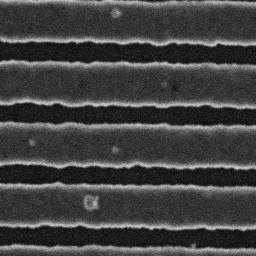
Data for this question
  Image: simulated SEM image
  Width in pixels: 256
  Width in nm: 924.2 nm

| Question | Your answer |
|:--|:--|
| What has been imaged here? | lines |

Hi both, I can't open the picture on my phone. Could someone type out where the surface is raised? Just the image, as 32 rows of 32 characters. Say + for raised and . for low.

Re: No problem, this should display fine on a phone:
+++++++++++++++++++.++++++++++++
++++++++++++++++++++++++++++++++
++++++++++++++++++++++++++++++++
++++++++++++++++++++++++++++++++
++++++++++++++++++++++++++++++++
...................++....++..+++
................................
................................
++++++++++++++++++++++++++++++++
++++++++++++++++++++++++++++++++
++++++++++++++++++++++++++++++++
++++++++++++++++++++++++++++++++
++++++++++++++++++++++++++++++++
..............................++
................................
++......+.......................
++++++++++++++++++++++++++++++++
++++++++++++++++++++++++++++++++
++++++++++++++++++++++++++++++++
++++++++++++++++++++++++++++++++
++.+++++++++++++++++++++++++++++
................................
................................
+++++++++++++++++++++++++++..+++
++++++++++++++++++++++++++++++++
++++++++++++++++++++++++++++++++
++++++++++++++++++++++++++++++++
++++++++++++++++++++++++++++++++
...................+.+++..+.++++
................................
................................
++++++++++++++++++++++++++++++++